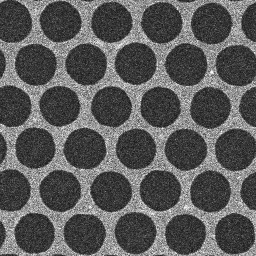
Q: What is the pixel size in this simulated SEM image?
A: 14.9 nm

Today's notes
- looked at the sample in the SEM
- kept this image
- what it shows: a regular array of holes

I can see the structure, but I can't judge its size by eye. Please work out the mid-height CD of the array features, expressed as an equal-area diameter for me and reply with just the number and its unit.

622 nm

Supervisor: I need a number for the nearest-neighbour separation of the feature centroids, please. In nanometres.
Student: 721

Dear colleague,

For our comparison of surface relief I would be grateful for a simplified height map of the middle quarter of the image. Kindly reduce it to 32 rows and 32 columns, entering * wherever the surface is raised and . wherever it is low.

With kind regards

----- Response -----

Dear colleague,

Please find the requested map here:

...........**..........**.......
...........**..........**.......
*.........***..........***......
**........****........****......
***......******......*******....
******.***********************..
..*******......******......*****
...*****........****........****
....***..........**..........***
....***..........**..........***
....***..........**..........***
....***..........**..........**.
....***..........**..........***
...*****........****........****
..******.......******.......****
**********....********....******
***....*********....********....
*........*****.......******.....
*.........****........****......
..........***..........**.......
..........***..........**.......
...........**..........**.......
...........**..........**.......
..........***..........***......
*........*****........****......
**......*******......******.....
**********************...****...
..*******.....*******......*****
...*****........****........****
....***.........***..........***
....***..........**..........***
....**...........**...........*.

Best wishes